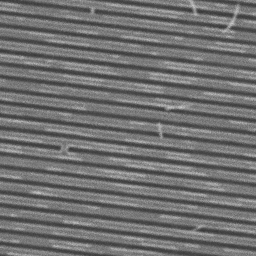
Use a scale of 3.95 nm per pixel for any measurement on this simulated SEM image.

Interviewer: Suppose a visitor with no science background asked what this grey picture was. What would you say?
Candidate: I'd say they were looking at parallel lines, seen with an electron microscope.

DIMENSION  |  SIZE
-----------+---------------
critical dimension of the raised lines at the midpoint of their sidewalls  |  0.0289 µm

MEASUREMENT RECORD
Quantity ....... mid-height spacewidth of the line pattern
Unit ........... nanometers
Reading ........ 21.6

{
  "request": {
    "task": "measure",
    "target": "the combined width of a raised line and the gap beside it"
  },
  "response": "50.3 nm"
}